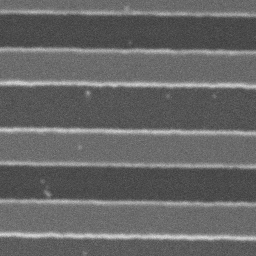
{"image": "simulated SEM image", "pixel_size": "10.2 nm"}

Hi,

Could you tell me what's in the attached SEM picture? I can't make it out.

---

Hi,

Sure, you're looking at lines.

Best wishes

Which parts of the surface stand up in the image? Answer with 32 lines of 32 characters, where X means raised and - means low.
XXXXXXXXXXXXXXXXXXXXXXXXXXXXXXXX
XXXXXXXXXXXXXXXXXXXXXXXXXXXXXXXX
--------------------------------
--------------------------------
--------------------------------
--------------------------------
XXXXXXXXXXXXXXXXXXXXXXXXXXXX----
XXXXXXXXXXXXXXXXXXXXXXXXXXXXXXXX
XXXXXXXXXXXXXXXXXXXXXXXXXXXXXXXX
XXXXXXXXXXXXXXXXXXXXXXXXXXXXXXXX
-----------XXXXXXXXXXXXXXXXXXXXX
--------------------------------
--------------------------------
--------------------------------
--------------------------------
--------------------------------
XXXXXXXXXXXXXXXXXXXXXXX--X------
XXXXXXXXXXXXXXXXXXXXXXXXXXXXXXXX
XXXXXXXXXXXXXXXXXXXXXXXXXXXXXXXX
XXXXXXXXXXXXXXXXXXXXXXXXXXXXXXXX
-XXXXXXXXXXXXXXXXXXXXXXXXXXXXXXX
--------------------------------
--------------------------------
--------------------------------
--------------------------------
XXXXXXXXXXXXXXXXXXXXXXXXXXXXXXX-
XXXXXXXXXXXXXXXXXXXXXXXXXXXXXXXX
XXXXXXXXXXXXXXXXXXXXXXXXXXXXXXXX
XXXXXXXXXXXXXXXXXXXXXXXXXXXXXXXX
---------XX--XXXXXXXXXXXXXXXXXXX
--------------------------------
--------------------------------